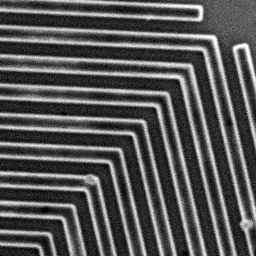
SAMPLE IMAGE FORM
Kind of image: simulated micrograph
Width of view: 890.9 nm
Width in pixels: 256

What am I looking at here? groups of lines, slits or small figures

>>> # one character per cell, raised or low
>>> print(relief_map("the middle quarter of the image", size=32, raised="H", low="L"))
HHHHHHHHHHHHHHHHHHHHHHHHHHHHHHHH
HHHHHHHHHHHHHHHHHHHHHHHHHHHHHHHH
LLLLLLLLLLLLLHHHHHHHHHHHHHHHHHHH
LLLLLLLLLLLLLLLLLLLLLLLLLLLLHHHH
LLLLLLLLLLLLLLLLLLLLLLLLLLLLLHHH
LLLLLLLLLLLLLLLLLLLLLLLLLLLLLLHH
HHHHHHLLLLLLLLLLLLLLLLLLLLLLLLHH
HHHHHHHHHHHHHHHHHHHHHHHHHHLLLLHH
HHHHHHHHHHHHHHHHHHHHHHHHHHLLLLHH
LLLLLLLHHHHHHHHHHHHHHHHHHHLLLLLH
LLLLLLLLLLLLLLLLLLLLLLLHHHHLLLLH
LLLLLLLLLLLLLLLLLLLLLLLLHHHLLLLH
LLLLLLLLLLLLLLLLLLLLLLLLHHHLLLLH
LLLLLLLLLLLLLLLLLLLLLLLLHHHLLLLH
HHHHHHHHHHHHHHHHHHHHLLLLHHHHLLLL
HHHHHHHHHHHHHHHHHHHHLLLLHHHHLLLL
HHHHHHHHHHHHHHHHHHHHHLLLLHHHLLLL
LLLLLLLLLLLLLLLLLHHHHLLLLHHHLLLL
LLLLLLLLLLLLLLLLLLHHHLLLLHHHHLLL
LLLLLLLLLLLLLLLLLLHHHLLLLHHHHLLL
LLLLLLLLLLLLLLLLLLHHHHLLLLHHHLLL
HHHHHHHHHHHHHHLLLLHHHHLLLLHHHLLL
HHHHHHHHHHHHHHLLLLLHHHLLLLHHHLLL
HHHHHHHHHHHHHHHLLLLHHHLLLLHHHHLL
LLLLLLLLLLLHHHHLLLLHHHLLLLLHHHLL
LLLLLLLLLLLLHHHLLLLHHHHLLLLHHHLL
LLLLLLLLLLLLHHHLLLLHHHHLLLLHHHLL
LLLLLLLLLLLLHHHHLLLLHHHLLLLHHHHL
HHHHHHHHLLLLHHHHLLLLHHHLLLLHHHHL
HHHHHHHHHLLLLHHHLLLLHHHHLLLLHHHL
HHHHHHHHHLLLLHHHLLLLHHHHLLLLHHHL
LLLLLHHHHLLLLHHHHLLLLHHHLLLLHHHL